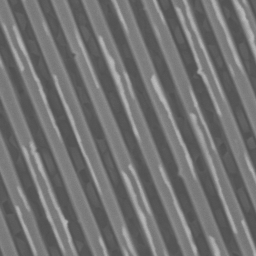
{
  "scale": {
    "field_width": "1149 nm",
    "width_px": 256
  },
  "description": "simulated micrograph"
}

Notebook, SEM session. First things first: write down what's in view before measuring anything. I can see parallel lines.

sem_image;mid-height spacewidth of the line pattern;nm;60.5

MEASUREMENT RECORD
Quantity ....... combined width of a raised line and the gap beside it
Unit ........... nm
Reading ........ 125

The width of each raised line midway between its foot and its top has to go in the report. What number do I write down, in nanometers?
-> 64.7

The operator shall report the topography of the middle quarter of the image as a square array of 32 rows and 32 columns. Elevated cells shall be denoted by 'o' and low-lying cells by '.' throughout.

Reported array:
....ooo....oooo....ooo....oooo..
....ooo.....ooo....oooo....ooo..
o...oooo....oooo...oooo....oooo.
o....ooo....oooo....ooo....oooo.
oo...oooo....oooo...oooo....ooo.
oo....ooo....oooo...oooo....oooo
oo....ooo.....ooo....oooo....ooo
ooo...oooo....oooo...oooo....ooo
ooo....ooo....oooo....ooo....ooo
oooo...oooo....ooo....oooo....oo
oooo....ooo....oooo....ooo....oo
oooo....oooo...oooo....oooo....o
.oooo...oooo....oooo...oooo....o
.oooo....ooo....oooo....ooo....o
..ooo....oooo...oooo....oooo....
..oooo....ooo....oooo....ooo....
..oooo....oooo...oooo....oooo...
...oooo...oooo....oooo...oooo...
...oooo....ooo....oooo....ooo...
...oooo....oooo...oooo....oooo..
....oooo....ooo....oooo....ooo..
o...oooo....oooo...oooo....oooo.
o....oooo...oooo....ooo....oooo.
o....oooo....ooo....oooo....oooo
oo...oooo....oooo...oooo....oooo
oo....oooo....ooo....oooo....ooo
ooo...oooo....oooo...oooo....ooo
ooo....ooo....oooo....ooo....ooo
ooo....oooo....oooo...oooo....oo
oooo....ooo....oooo...oooo....oo
.ooo....oooo...oooo....oooo....o
.oooo....ooo....oooo...oooo....o